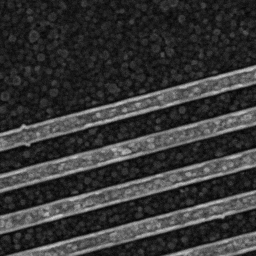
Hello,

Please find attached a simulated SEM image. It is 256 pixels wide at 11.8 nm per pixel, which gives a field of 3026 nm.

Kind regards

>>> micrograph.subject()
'parallel lines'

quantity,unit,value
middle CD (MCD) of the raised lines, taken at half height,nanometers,189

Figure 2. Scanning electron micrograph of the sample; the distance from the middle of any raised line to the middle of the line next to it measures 0.474 um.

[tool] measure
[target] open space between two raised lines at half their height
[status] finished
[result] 289 nm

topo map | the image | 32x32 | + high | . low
................................
................................
................................
................................
................................
................................
................................
................................
...............................+
...........................+++++
........................+++++++.
....................+++++++.....
................++++++++........
............++++++++............
.........+++++++............++++
.....+++++++............++++++++
.++++++++............+++++++....
+++++............+++++++........
+............++++++++...........
.........++++++++............+++
.....++++++++............+++++++
..+++++++............++++++++...
++++++............+++++++.......
++............++++++++..........
..........++++++++...........+++
......++++++++............++++++
...+++++++............++++++++..
++++++............++++++++......
+++............+++++++..........
...........+++++++............++
.......+++++++............++++++
...++++++++............+++++++..